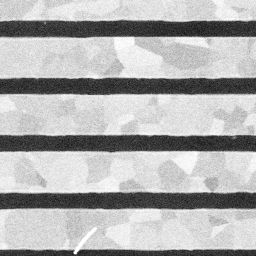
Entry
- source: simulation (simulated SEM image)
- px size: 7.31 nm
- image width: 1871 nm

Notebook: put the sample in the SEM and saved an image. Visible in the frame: lines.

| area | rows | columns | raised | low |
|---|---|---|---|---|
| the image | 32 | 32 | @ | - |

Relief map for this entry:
@@@@@@@@@@@@@@@@@@@@@@@@@@@@@@@@
@@@@@@@@@@@@@@@@@@@@@@@@@@@@@@@@
@@@@@@@@@@@@@@@@@@@@@@@@@@@@@@@@
--------------------------------
--------------------------------
@@@@@@@@@@@@@@@@@@@@@@@@@@@@@@@@
@@@@@@@@@@@@@@@@@@@@@@@@@@@@@@@@
@@@@@@@@@@@@@@@@@@@@@@@@@@@@@@@@
@@@@@@@@@@@@@@@@@@@@@@@@@@@@@@@@
@@@@@@@@@@@@@@@@@@@@@@@@@@@@@@@@
--------------------------------
--------------------------------
@@@@@@@@@@@@@@@@@@@@@@@@@@@@@@@@
@@@@@@@@@@@@@@@@@@@@@@@@@@@@@@@@
@@@@@@@@@@@@@@@@@@@@@@@@@@@@@@@@
@@@@@@@@@@@@@@@@@@@@@@@@@@@@@@@@
@@@@@@@@@@@@@@@@@@@@@@@@@@@@@@@@
--------------------------------
--------------------------------
@@@@@@@@@@@@@@@@@@@@@@@@@@@@@@@@
@@@@@@@@@@@@@@@@@@@@@@@@@@@@@@@@
@@@@@@@@@@@@@@@@@@@@@@@@@@@@@@@@
@@@@@@@@@@@@@@@@@@@@@@@@@@@@@@@@
@@@@@@@@@@@@@@@@@@@@@@@@@@@@@@@@
--------------------------------
--------------------------------
@@@@@@@@@@@@@@@@@@@@@@@@@@@@@@@@
@@@@@@@@@@@@@@@@@@@@@@@@@@@@@@@@
@@@@@@@@@@@@@@@@@@@@@@@@@@@@@@@@
@@@@@@@@@@@@@@@@@@@@@@@@@@@@@@@@
@@@@@@@@@@@@@@@@@@@@@@@@@@@@@@@@
--------------------------------